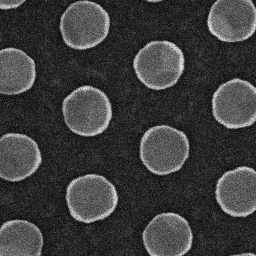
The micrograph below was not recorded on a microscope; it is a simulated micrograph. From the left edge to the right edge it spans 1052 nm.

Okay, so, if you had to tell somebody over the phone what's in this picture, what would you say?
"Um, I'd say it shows raised bodies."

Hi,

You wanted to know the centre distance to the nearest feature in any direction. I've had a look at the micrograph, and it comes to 0.351 um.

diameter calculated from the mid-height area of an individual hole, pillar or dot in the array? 196 nm